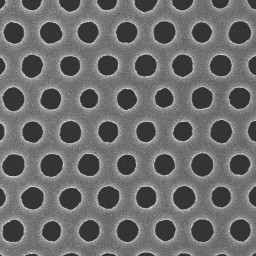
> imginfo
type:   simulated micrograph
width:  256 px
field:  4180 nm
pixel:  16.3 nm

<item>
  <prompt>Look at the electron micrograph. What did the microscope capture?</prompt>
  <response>a regular array of holes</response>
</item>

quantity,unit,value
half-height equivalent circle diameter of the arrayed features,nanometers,354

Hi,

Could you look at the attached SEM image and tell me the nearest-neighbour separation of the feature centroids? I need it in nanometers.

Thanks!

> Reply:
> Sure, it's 610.